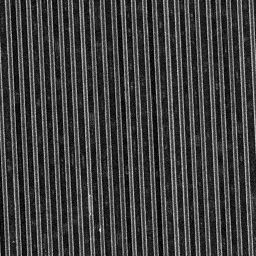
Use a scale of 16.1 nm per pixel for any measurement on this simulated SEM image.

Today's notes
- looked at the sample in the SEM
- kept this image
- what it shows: parallel lines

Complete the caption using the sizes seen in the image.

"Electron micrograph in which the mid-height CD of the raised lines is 70.1 nanometres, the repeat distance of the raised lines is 169 nanometers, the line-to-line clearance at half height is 98.2 nanometres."